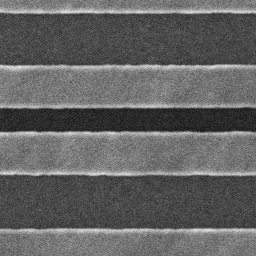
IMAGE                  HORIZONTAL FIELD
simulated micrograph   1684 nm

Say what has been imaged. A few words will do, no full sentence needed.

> lines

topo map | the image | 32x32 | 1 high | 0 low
11111111111111111111111111111111
01111111111111111111111111100111
00000000000000000000000000000000
00000000000000000000000000000000
00000000000000000000000000000000
00000000000000000000000000000000
00000000000000000000000000000000
00000000000000000000000000000000
11111111111111111111111111111111
11111111111111111111111111111111
11111111111111111111111111111111
11111111111111111111111111111111
11111111111111111111111111111111
01111111000000000000000000000000
00000000000000000000000000000000
00000000000000000000000000000000
00000000000000000000000000000100
11111111111111111111111111111111
11111111111111111111111111111111
11111111111111111111111111111111
11111111111111111111111111111111
11111111111111111111111111111111
00000000000000000000000000000000
00000000000000000000000000000000
00000000000000000000000000000000
00000000000000000000000000000000
00000000000000000000000000000000
00000000000000000000000000000000
00000000000000000000000000000000
11111111111111111111111111111111
11111111111111111111111111111111
11111111111111111111111111111111